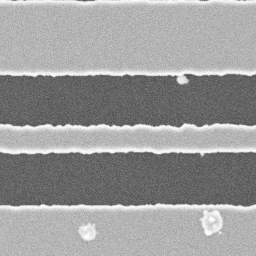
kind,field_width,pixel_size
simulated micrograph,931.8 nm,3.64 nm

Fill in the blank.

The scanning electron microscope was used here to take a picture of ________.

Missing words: lines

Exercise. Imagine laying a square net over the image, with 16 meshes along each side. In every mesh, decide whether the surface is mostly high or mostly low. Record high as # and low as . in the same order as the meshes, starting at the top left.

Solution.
################
################
################
################
################
................
................
................
################
######...#####..
................
................
................
################
################
################